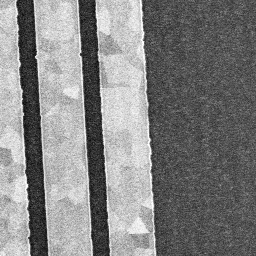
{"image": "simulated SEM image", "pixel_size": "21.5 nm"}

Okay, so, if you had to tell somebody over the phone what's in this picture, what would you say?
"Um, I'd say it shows one or a few lines or trenches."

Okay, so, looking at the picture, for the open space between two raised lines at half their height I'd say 18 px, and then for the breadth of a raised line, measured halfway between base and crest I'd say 947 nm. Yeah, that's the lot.